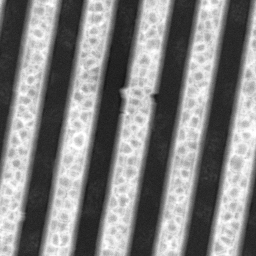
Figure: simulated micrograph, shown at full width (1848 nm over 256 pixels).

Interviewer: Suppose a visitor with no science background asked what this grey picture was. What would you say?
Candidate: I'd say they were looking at parallel lines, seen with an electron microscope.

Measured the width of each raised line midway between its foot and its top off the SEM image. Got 212 nm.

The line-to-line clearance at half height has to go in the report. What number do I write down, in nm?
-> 190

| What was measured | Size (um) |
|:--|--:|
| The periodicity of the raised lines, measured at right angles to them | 0.397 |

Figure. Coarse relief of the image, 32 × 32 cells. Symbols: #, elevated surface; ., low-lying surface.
....###....###....###....###....
....###....###...####....###...#
...####...####...####...####...#
...####...####...####...####...#
...####...####...####...####...#
...###....####...###....###....#
...###....###....###....###....#
...###...####...####...####...##
..####...####...####...####...##
..####...####...####...####...##
..####...####...####...####...##
..###....###...####....###....##
..###....###....###....###....##
..###...####...####...####...###
.####...####...####...####...###
.####...####...####...####...###
.####...####...####...###....###
.###....###....###....###....###
.###....###...####....###....###
####...####...####...####...####
####...####...####...####...####
####...####...####...####...####
###....####...###....###....####
###....###....###....###....###.
###...####...####....###...####.
###...####...####...####...####.
###...####...####...####...####.
###...####...####...####...####.
##....####...####...###....###..
##....###....###....###....###..
##...####...####...####...####..
##...####...####...####...####..